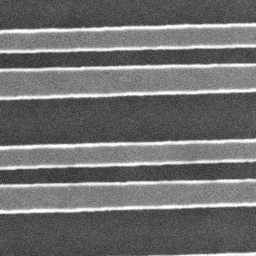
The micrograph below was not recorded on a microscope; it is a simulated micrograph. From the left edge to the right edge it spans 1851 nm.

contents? lines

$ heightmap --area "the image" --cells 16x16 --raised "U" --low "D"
DDDDDDDDDDDDDDDD
DDDDDDDDDDDDDDDD
UUUUUUUUUUUUUUUU
UUUUUUUUUUUUUUUU
UUUUUUUUUUUUUUUU
UUUUUUUUUUUUUUUU
DDDDDDDDDDDDDDDD
DDDDDDDDDDDDDDDD
DDDDDDDDDDDDDDDD
UUUUUUUUUUUUUUUU
UUUUUUUUUUUUUUUU
UUUUUUUUUUUUUUUU
UUUUUUUUUUUUUUUU
DDDDDDDDDDDDDDDD
DDDDDDDDDDDDDDDD
DDDDDDDDDDDDDDDD